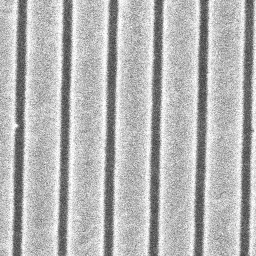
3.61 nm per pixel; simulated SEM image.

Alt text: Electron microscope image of parallel lines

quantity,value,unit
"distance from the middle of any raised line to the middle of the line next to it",164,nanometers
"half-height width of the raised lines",0.127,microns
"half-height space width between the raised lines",38.4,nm